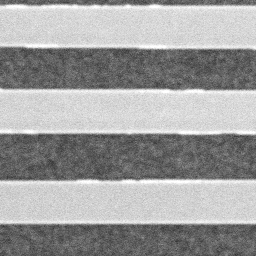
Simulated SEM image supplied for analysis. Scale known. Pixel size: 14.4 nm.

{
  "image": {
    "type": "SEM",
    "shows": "lines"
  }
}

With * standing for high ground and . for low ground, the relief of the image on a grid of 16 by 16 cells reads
****************
****************
****************
................
................
................
****************
****************
................
................
................
****************
****************
****************
................
................